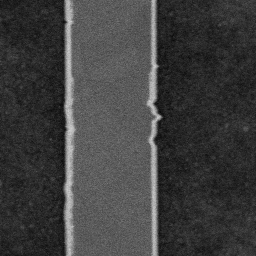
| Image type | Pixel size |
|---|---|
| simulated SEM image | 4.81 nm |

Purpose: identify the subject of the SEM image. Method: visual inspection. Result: one or a few lines or trenches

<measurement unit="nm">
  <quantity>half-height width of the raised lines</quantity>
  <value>408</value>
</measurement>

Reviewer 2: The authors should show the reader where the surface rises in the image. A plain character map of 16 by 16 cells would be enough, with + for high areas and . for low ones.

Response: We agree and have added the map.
....++++++......
....++++++......
....++++++......
....++++++......
....++++++......
....++++++......
....+++++.......
....++++++......
....+++++.......
....++++++......
....++++++......
....++++++......
....++++++......
....++++++......
....++++++......
....++++++......